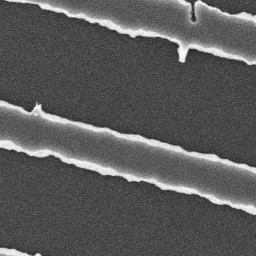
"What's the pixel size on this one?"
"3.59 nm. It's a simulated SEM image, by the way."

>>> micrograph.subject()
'one or a few lines or trenches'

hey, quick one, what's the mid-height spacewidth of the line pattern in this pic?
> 367 nanometres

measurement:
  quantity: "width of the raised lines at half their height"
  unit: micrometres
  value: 0.144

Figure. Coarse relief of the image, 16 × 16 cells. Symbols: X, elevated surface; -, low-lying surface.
---XXXXXXXXXX---
-------XXXXXXXXX
-----------XXXXX
--------------XX
----------------
----------------
----------------
XXXX------------
XXXXXXXX--------
--XXXXXXXXXX----
------XXXXXXXXXX
----------XXXXXX
-------------XXX
----------------
----------------
----------------